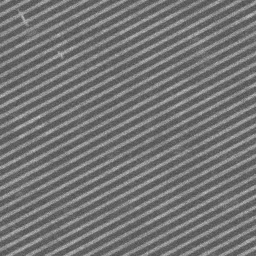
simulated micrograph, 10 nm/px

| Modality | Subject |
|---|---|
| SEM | parallel lines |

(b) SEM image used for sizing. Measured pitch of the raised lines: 0.0907 µm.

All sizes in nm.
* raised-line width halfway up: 18.8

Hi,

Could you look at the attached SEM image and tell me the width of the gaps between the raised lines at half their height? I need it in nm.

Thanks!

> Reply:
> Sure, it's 68.8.